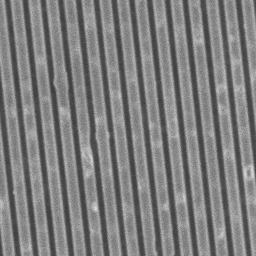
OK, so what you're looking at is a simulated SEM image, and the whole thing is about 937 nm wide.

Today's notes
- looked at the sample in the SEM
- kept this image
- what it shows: parallel lines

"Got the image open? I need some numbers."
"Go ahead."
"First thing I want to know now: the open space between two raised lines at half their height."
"23.1 nanometres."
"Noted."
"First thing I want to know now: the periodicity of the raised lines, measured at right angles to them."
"64.6 nm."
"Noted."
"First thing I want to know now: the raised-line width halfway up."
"42.7 nm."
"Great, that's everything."